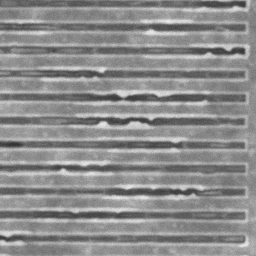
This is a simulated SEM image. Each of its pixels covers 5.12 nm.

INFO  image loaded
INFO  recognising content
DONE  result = parallel lines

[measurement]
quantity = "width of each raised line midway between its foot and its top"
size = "73.6 nanometres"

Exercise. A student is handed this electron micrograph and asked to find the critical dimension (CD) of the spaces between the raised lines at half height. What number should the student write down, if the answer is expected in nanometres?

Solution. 46.1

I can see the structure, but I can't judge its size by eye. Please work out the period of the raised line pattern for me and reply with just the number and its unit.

120 nm